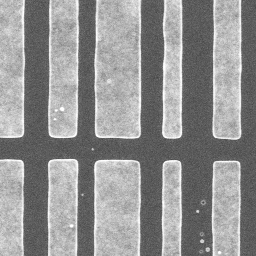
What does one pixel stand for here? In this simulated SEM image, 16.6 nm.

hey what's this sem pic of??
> groups of lines, slits or small figures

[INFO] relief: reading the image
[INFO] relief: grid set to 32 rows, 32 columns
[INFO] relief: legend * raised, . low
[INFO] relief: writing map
***...****..*****....**....***..
***...****..*****....**....***..
***...****..*****...***....***..
***...****..*****...***....***..
***...****..*****....**....***..
***...****..*****....**....***..
***...****..*****....**....***..
***...****..*****....**....***..
***...****..*****....**....***..
***...****..*****....**....***..
***...****..*****...***....***..
***...****..*****...***....***..
***...****..*****...***....***..
***...****..*****...***....***..
***...****..*****...***....***..
***...****..*****...***....***..
***...****..*****...***....***..
................................
................................
................................
***...****..*****....**....***..
***...****..*****...***....***..
***...****..*****...***....***..
***...****..*****...***....***..
***...****..*****...***....***..
***...****..*****...***....***..
***...****..*****...***....***..
***...****..*****...***....***..
***...****..*****...***....***..
***...****..*****...***....***..
***...****..*****...**.....***..
***...****..*****...***....***..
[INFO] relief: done